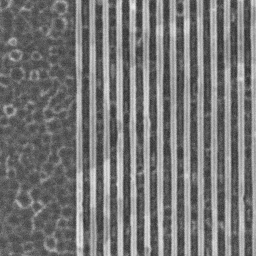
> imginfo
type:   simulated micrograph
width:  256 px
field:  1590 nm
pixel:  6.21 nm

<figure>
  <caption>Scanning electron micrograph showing parallel lines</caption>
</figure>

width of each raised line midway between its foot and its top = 24.1 nm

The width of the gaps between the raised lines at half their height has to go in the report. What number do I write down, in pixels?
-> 9.61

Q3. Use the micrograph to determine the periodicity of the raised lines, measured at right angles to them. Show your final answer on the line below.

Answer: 83.7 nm